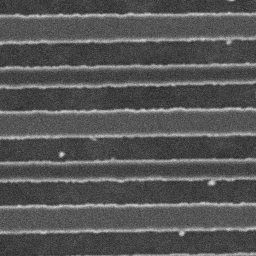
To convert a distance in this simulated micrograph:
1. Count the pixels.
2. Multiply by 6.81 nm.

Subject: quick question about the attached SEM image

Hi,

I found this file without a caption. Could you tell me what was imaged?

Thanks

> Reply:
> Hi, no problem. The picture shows lines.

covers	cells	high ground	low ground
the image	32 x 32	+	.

................................
................................
++++++++++++++++++++++++++++++++
++++++++++++++++++++++++++++++++
++++++++++++++++++++++++++++++++
................................
................................
................................
++++++++++++++++++++++++++++++++
++++++++++++++++++++++++++++++++
+++++++++++++++++++++++++++++...
................................
................................
................................
++++++++++++++++++++++++++++++++
++++++++++++++++++++++++++++++++
++++++++++++++++++++++++++++++++
................................
................................
................................
++++++++++++++++++++++++++++++++
++++++++++++++++++++++++++++++++
++++++++++++++++++.....+..+.+...
................................
................................
......................++++++++++
++++++++++++++++++++++++++++++++
++++++++++++++++++++++++++++++++
++++++++++++++++++++++++++++++++
................................
................................
................................